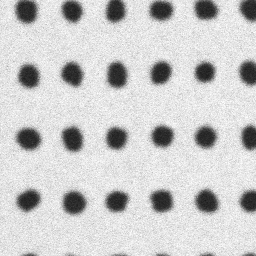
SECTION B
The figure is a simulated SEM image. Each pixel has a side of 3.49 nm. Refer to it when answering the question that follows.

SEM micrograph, a regular array of holes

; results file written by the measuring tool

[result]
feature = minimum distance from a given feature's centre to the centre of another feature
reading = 0.153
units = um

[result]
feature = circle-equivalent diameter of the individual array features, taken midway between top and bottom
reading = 0.0751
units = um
